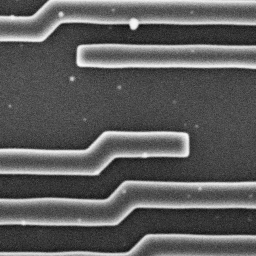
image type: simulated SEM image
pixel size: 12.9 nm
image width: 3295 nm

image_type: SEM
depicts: groups of lines, slits or small figures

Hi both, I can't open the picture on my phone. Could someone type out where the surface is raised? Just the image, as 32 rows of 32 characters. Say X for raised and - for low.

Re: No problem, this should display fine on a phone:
------XXXXXXXXXXXXXXXXXXXXXXXXXX
-----XXXXXXXXXXXXXXXXXXXXXXXXXXX
XXXXXXXXXXXXXXXXXXXXXXXXXXXXXXXX
XXXXXXX-------------------------
XXXXXX--------------------------
--------------------------------
----------XXXXXXXXXXXXXXXXXXXXXX
----------XXXXXXXXXXXXXXXXXXXXXX
--------------------------------
--------------------------------
--------------------------------
--------------------------------
--------------------------------
--------------------------------
--------------------------------
--------------------------------
--------------------------------
------------XXXXXXXXXXX---------
-----------XXXXXXXXXXXX---------
XXXXXXXXXXXXXXX--XX-------------
XXXXXXXXXXXXX-------------------
XXXXXXXXXXXX--------------------
--------------------------------
---------------XXXXXXXXXXXXXXXXX
--------------XXXXXXXXXXXXXXXXXX
XXXXXXXXXXXXXXXXXXXXXXXXXXXXXXXX
XXXXXXXXXXXXXXXX----------------
XXXXXXXXXXXXXXX-----------------
--------------------------------
------------------XXXXXX--------
-----------------XXXXXXXXXXXXXXX
----------------XXXXXXXXXXXXXXXX